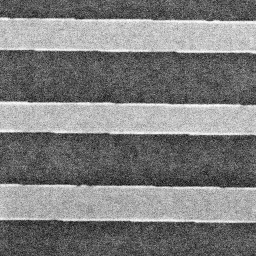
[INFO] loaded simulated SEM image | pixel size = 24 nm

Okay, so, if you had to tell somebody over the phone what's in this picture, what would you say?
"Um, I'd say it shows lines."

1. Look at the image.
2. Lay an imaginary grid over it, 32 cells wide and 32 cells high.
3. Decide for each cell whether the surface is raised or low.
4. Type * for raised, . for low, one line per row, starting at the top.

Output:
................................
................................
********........................
********************************
********************************
********************************
................................
................................
................................
................................
................................
................................
................................
********************************
********************************
********************************
......**************************
................................
................................
................................
................................
................................
................................
***************************.....
********************************
********************************
********************************
.......*************************
................................
................................
................................
................................